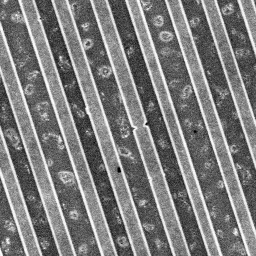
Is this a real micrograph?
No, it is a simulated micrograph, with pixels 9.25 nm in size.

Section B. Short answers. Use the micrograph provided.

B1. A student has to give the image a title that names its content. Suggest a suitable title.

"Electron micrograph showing parallel lines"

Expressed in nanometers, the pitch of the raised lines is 325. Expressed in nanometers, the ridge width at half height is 129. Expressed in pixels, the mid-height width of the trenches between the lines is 21.3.